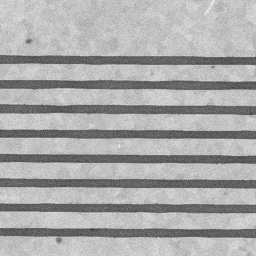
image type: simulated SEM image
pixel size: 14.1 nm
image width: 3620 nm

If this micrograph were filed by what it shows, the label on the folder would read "groups of lines, slits or small figures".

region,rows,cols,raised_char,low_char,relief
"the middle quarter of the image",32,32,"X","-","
XXXXXXXXXXXXXXXXXXXXXXXXXXXXXXXX
XXXXXXXXXXXXXXXXXXXXXXXXXXXXXXXX
XXXXXXXXXXXXXXXXXXXXXXXXXXXXXXXX
XXXXXXXXXXXXXXXXXXXXXXXXXXXXXXXX
--------------------------------
--------------------------------
XXXXXXXXXXXX---XXXXXXXXXXX------
XXXXXXXXXXXXXXXXXXXXXXXXXXXXXXXX
XXXXXXXXXXXXXXXXXXXXXXXXXXXXXXXX
XXXXXXXXXXXXXXXXXXXXXXXXXXXXXXXX
--------------------------------
--------------------------------
XXXXXXXXXX----------------------
XXXXXXXXXXXXXXXXXXXXXXXXXXXXXXXX
XXXXXXXXXXXXXXXXXXXXXXXXXXXXXXXX
XXXXXXXXXXXXXXXXXXXXXXXXXXXXXXXX
-----------------------------XXX
--------------------------------
--------------------------------
XXXXXXXXXXXXXXXXXXXXXXXXXXXXXXXX
XXXXXXXXXXXXXXXXXXXXXXXXXXXXXXXX
XXXXXXXXXXXXXXXXXXXXXXXXXXXXXXXX
------------------XXXXXXXXXXXXXX
--------------------------------
--------------------------------
XXXXXXXXXXXXXXXXXXXXXXXXXXXXXXXX
XXXXXXXXXXXXXXXXXXXXXXXXXXXXXXXX
XXXXXXXXXXXXXXXXXXXXXXXXXXXXXXXX
XXXXXXXXXXXXXXXXXXXXXXXXXXXXXXXX
--------------------------------
--------------------------------
XXXXXXXXXXXXXXXXXXXXXXXXXXXXXXXX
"